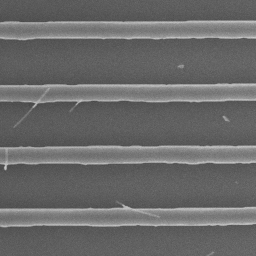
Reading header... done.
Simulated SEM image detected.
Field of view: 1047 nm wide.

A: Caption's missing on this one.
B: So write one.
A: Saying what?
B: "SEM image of lines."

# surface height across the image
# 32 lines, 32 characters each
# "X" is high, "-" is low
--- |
--------------------------------
--------------------------------
--------------------------------
XXXXXXXXXXXXXXXXXXXXXXXXXXXXXXXX
XXXXXXXXXXXXXXXXXXXXXXXXXXXXXXXX
--------------------------------
--------------------------------
--------------------------------
--------------------------------
--------------------------------
--------------------------------
XXXXXXXXXXXXXXXXXXXXXXXXXXXXXXXX
XXXXXXXXXXXXXXXXXXXXXXXXXXXXXXXX
--------------------------------
--------------------------------
--------------------------------
--------------------------------
--------------------------------
XXXXXXXXXXXXXXXXXXXXXXXXXXXXXXXX
XXXXXXXXXXXXXXXXXXXXXXXXXXXXXXXX
X-------------------------------
--------------------------------
--------------------------------
--------------------------------
--------------------------------
--------------------------------
XXXXXXXXXXXXXXXXXXXXXXXXXXXXXXXX
XXXXXXXXXXXXXXXXXXXXXXXXXXXXXXXX
--------------------------------
--------------------------------
--------------------------------
--------------------------------